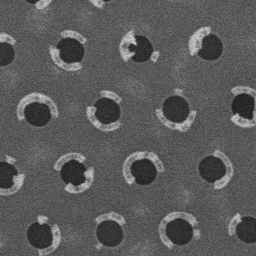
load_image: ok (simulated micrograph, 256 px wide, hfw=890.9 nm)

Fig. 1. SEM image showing a regular array of holes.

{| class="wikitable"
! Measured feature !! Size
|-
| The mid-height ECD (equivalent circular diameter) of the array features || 92.7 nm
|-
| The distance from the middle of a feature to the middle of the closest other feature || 0.239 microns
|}